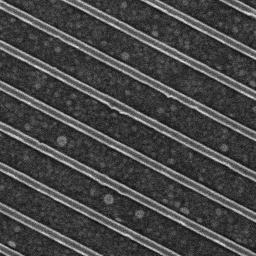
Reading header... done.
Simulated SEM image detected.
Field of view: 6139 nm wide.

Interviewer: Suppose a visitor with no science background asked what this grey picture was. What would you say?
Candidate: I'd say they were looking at parallel lines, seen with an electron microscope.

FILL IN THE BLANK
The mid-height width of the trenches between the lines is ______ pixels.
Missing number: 28.6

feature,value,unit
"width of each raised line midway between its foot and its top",176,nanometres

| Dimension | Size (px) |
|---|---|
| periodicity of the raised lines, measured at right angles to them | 36.1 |